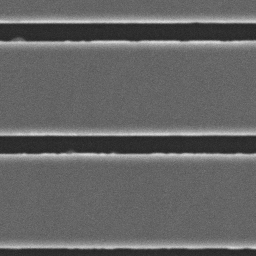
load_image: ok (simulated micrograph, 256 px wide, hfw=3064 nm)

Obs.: lines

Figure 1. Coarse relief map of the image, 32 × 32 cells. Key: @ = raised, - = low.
@@@@@@@@@@@@@@@@@@@@@@@@@@@@@@@@
@@@@@@@@@@@@@@@@@@@@@@@@@@@@@@@@
@@@@@@@@@@@@@@@@@@@@@@@@@@@@@@@@
--------------------------------
--------------------------------
@@@@@@@@@@@@@@@@@@@@@@@@@@@@@@@@
@@@@@@@@@@@@@@@@@@@@@@@@@@@@@@@@
@@@@@@@@@@@@@@@@@@@@@@@@@@@@@@@@
@@@@@@@@@@@@@@@@@@@@@@@@@@@@@@@@
@@@@@@@@@@@@@@@@@@@@@@@@@@@@@@@@
@@@@@@@@@@@@@@@@@@@@@@@@@@@@@@@@
@@@@@@@@@@@@@@@@@@@@@@@@@@@@@@@@
@@@@@@@@@@@@@@@@@@@@@@@@@@@@@@@@
@@@@@@@@@@@@@@@@@@@@@@@@@@@@@@@@
@@@@@@@@@@@@@@@@@@@@@@@@@@@@@@@@
@@@@@@@@@@@@@@@@@@@@@@@@@@@@@@@@
@@@@@@@@@@@@@@@@@@@@@@@@@@@@@@@@
--------------------------------
--------------------------------
@@@@@@@@@@@@@@@@@@@@@@@@@@@@@@@@
@@@@@@@@@@@@@@@@@@@@@@@@@@@@@@@@
@@@@@@@@@@@@@@@@@@@@@@@@@@@@@@@@
@@@@@@@@@@@@@@@@@@@@@@@@@@@@@@@@
@@@@@@@@@@@@@@@@@@@@@@@@@@@@@@@@
@@@@@@@@@@@@@@@@@@@@@@@@@@@@@@@@
@@@@@@@@@@@@@@@@@@@@@@@@@@@@@@@@
@@@@@@@@@@@@@@@@@@@@@@@@@@@@@@@@
@@@@@@@@@@@@@@@@@@@@@@@@@@@@@@@@
@@@@@@@@@@@@@@@@@@@@@@@@@@@@@@@@
@@@@@@@@@@@@@@@@@@@@@@@@@@@@@@@@
@@@@@@@@@@@@@@@@@@@@@@@@@@@@@@@@
--------------------------------